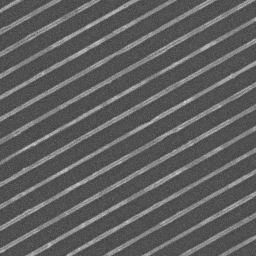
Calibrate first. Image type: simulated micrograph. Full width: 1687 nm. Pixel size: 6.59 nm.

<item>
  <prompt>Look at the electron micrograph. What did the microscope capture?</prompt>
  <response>parallel lines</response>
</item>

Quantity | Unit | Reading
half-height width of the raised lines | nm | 23.7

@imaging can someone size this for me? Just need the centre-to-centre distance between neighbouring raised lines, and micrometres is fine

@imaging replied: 0.125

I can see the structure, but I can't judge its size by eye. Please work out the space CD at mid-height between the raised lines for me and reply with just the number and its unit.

0.102 um